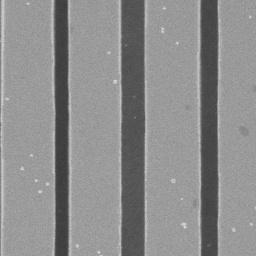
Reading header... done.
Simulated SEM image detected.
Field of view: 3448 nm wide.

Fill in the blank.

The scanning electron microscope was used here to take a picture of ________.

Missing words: lines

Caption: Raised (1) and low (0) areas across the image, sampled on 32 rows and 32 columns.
11111110011111100011111110011111
11111110011111100011111110011111
11111110011111100011111110011111
11111110011111100011111110011111
11111110011111100011111110011111
11111110011111100011111110011111
11111110011111100011111110011111
11111110011111100011111110011111
11111110011111100011111110011111
11111110011111100011111110011111
11111110011111100011111110011111
11111110011111100011111110011111
11111110011111100011111110011111
11111110011111100011111110011111
11111110011111100011111110011111
11111110011111100011111110011111
11111110011111100011111110011111
11111110011111100011111110011111
11111110011111100011111110011111
11111110011111100011111110011111
11111110011111100011111110011111
11111110011111100011111110011111
11111110011111100011111110011111
11111110011111100011111110011111
11111110011111100011111110011111
11111110011111100011111110011111
11111110011111100011111110011111
11111110011111100011111110011111
11111110011111100011111110011111
11111110011111100011111110011111
11111110011111100011111110011111
11111110011111100011111110011111